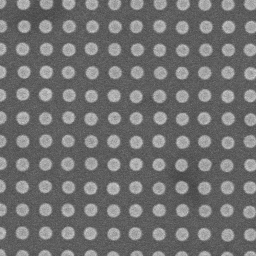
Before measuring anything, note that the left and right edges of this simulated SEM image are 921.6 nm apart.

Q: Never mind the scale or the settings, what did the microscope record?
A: a regular array of raised bodies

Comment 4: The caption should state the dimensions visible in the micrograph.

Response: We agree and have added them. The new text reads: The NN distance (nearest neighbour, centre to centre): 22.1 px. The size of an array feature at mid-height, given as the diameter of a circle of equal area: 44.3 nm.